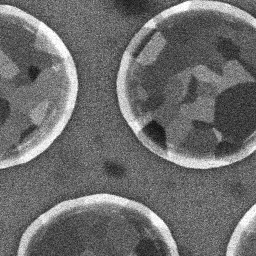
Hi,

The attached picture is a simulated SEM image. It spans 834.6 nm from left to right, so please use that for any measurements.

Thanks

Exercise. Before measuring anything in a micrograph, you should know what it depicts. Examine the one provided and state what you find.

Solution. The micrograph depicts raised bodies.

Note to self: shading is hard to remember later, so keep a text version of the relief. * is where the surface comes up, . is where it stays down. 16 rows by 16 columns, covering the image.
...........***..
**........******
***......*******
****....********
****....********
*****...********
****....********
****....********
***......*******
**........*****.
................
................
......*.........
...******.......
..********.....*
.**********....*